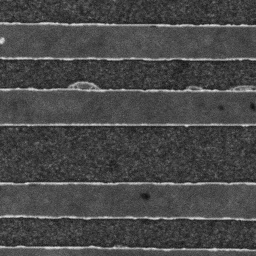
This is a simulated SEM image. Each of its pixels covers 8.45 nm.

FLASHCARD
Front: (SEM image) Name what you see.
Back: lines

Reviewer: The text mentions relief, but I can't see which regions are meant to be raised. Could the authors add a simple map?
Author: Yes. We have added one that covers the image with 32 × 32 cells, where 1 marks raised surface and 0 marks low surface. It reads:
00000000000000000000000000000000
00000000000000000000000000000000
00000000000000000000000000000000
11111111111111111111111111111111
11111111111111111111111111111111
11111111111111111111111111111111
11111111111111111111111111111111
00000000000000000000000000000000
00000000000000000000000000000000
00000000000000000000000000000000
00000000000000000000000000000000
11111111111111111111111111111111
11111111111111111111111111111111
11111111111111111111111111111111
11111111111111111111111111111111
11111111111111111111111111111111
00000000000000000000000000000000
00000000000000000000000000000000
00000000000000000000000000000000
00000000000000000000000000000000
00000000000000000000000000000000
00000000000000000000000000000000
00000000000000000000000000000000
11111111111111111111111111111111
11111111111111111111111111111111
11111111111111111111111111111111
11111111111111111111111111111111
00000000000000000000000000000000
00000000000000000000000000000000
00000000000000000000000000000000
00000000000000000000000000000000
11111111111111111111111111111111